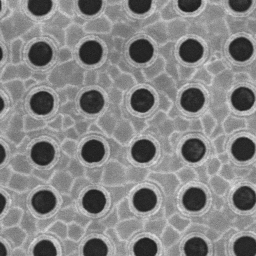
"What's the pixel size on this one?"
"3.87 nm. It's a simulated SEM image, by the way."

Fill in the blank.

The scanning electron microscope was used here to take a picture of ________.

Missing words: a regular array of holes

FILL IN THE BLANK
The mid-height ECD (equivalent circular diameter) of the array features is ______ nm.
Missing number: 96.6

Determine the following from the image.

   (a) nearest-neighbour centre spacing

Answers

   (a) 49.2 pixels